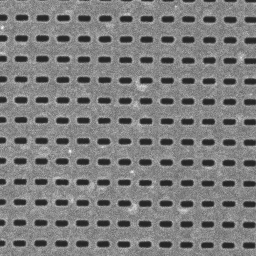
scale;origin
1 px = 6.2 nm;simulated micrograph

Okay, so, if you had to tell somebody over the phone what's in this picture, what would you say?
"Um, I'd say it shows a regular array of holes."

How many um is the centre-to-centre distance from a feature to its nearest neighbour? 0.125